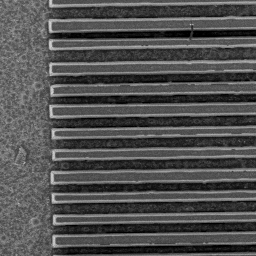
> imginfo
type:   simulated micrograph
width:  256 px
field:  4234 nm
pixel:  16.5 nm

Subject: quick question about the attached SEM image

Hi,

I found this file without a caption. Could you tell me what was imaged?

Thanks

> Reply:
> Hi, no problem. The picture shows parallel lines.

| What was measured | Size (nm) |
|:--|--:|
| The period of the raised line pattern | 354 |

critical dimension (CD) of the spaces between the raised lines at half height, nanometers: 194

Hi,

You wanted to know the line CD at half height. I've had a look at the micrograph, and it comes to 163 nanometres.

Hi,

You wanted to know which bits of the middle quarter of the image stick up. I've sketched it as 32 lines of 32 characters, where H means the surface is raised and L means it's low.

HHHHHHHHHHHHHHHHHHHHHHHHHHHHHHHH
HHHHHHHHHHHHHHHHHHHHHHHHHHHHHHHH
LHHHHLLLLLLLLLLLLLLLLLLLLLLLLLLL
LLLLLLLLLLLLLLLLLLLLLLLLLLLLLLLL
LLLLLLLLLLLLLLLLLLLLLLLLLLLLLLLL
HHHHHHHHHHHHHHHHHHHHHHHHHHHHHHHH
HHHHHHHHHHHHHHHHHHHHHHHHHHHHHHHH
HHHHHHHHHHHHHHHHHHHHLLLLLLLLLLLL
LLLLLLLLLLLLLLLLLLLLLLLLLLLLLLLL
LLLLLLLLLLLLLLLLLLLLLLLLLLLLLLLL
HHHHHHHHHHHHHHHHHHHHHHHHHHHHHHHH
HHHHHHHHHHHHHHHHHHHHHHHHHHHHHHHH
HHHHHHHHHHHHHHHHHHHHHHHHHHHHHHHH
LLLLLLLLLLLLLLLLLLLLLLLLLLLLLLLL
LLLLLLLLLLLLLLLLLLLLLLLLLLLLLLLL
LLLLLLLLLLLLLLLLLLLLLLLLLLLLLLLL
HHHHHHHHHHHHHHHHHHHHHHHHHHHHHHHH
HHHHHHHHHHHHHHHHHHHHHHHHHHHHHHHH
LLLLLLLLLLLLLLLLLLLLLLLLLLLLLLLL
LLLLLLLLLLLLLLLLLLLLLLLLLLLLLLLL
LLLLLLLLLLLLLLLLLLLLLLLLLLLLLLLL
LLLLLLLLLLLLLLLLLLHHHHHHHHHHHHHH
HHHHHHHHHHHHHHHHHHHHHHHHHHHHHHHH
HHHHHHHHHHHHHHHHLLLLHHHHHHHLLLLL
LLLLLLLLLLLLLLLLLLLLLLLLLLLLLLLL
LLLLLLLLLLLLLLLLLLLLLLLLLLLLLLLL
LLLLLLLLLLLLLLLLLLLLLLLLLLLLLLLL
HHHHHHHHHHHHHHHHHHHHHHHHHHHHHHHH
HHHHHHHHHHHHHHHHHHHHHHHHHHHHHHHH
HHHHHHHHLLLLLLHHHHHHLLLLLLLLLLLL
LLLLLLLLLLLLLLLLLLLLLLLLLLLLLLLL
LLLLLLLLLLLLLLLLLLLLLLLLLLLLLLLL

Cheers